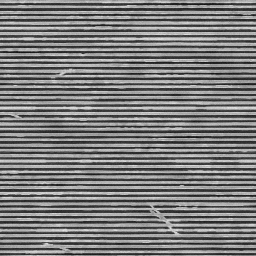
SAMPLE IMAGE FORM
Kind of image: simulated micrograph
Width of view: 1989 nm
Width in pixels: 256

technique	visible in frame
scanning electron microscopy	parallel lines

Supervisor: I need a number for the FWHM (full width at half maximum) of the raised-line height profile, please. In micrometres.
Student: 0.0223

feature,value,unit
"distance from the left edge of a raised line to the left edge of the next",41.5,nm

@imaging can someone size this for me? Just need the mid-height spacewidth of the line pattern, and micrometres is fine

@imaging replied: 0.0223